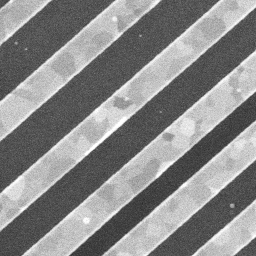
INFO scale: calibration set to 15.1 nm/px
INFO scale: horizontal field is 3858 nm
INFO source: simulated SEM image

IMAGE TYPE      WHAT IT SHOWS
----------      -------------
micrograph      lines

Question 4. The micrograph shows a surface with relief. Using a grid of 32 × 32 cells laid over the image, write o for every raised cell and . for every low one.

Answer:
.ooooo........oooooo.......ooooo
ooooo........ooooo........ooooo.
oooo........ooooo........ooooo..
oo.........ooooo........ooooo...
o........oooooo........ooooo....
........oooooo.......oooooo.....
.......oooooo.......oooooo......
......oooooo.......ooooo.......o
.....ooooo........ooooo.......oo
....ooooo........ooooo......oooo
...ooooo........ooooo......ooooo
.oooooo.......oooooo......oooooo
oooooo.......oooooo......oooooo.
ooooo.......oooooo......oooooo..
oooo.......ooooo.......ooooo....
oo........ooooo......oooooo....o
o........ooooo......oooooo....oo
........ooooo......oooooo....ooo
.......ooooo......oooooo....oooo
.....oooooo......oooooo....ooooo
....oooooo......ooooo.....ooooo.
...ooooo.......ooooo.....ooooo..
..ooooo.......ooooo.....ooooo...
.ooooo......oooooo....oooooo....
ooooo......oooooo....oooooo.....
oooo......oooooo....oooooo.....o
ooo......oooooo....oooooo.....oo
oo......oooooo....ooooo......ooo
.......ooooo.....ooooo......oooo
......ooooo.....ooooo......ooooo
....oooooo....oooooo......ooooo.
...oooooo....oooooo......ooooo..